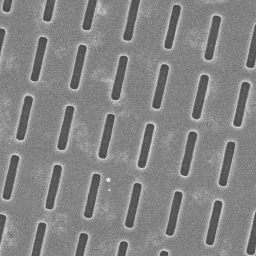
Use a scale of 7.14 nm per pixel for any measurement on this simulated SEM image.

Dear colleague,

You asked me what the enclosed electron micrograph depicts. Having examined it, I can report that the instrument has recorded a regular array of holes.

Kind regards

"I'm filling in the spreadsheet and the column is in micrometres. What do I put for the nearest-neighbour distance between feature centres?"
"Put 0.294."